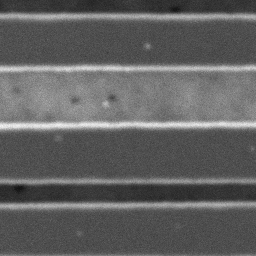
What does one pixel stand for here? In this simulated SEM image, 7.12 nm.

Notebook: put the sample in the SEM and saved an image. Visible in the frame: lines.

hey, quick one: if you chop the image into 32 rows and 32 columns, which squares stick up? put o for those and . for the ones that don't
................................
................................
oooooooooooooooooooooooooooooooo
oooooooooooooooooooooooooooooooo
oooooooooooooooooooooooooooooooo
oooooooooooooooooooooooooooooooo
oooooooooooooooooooooooooooooooo
oooooooooooooooooooooooooooooooo
oooooooooooooooooooooooooooooooo
................................
................................
................................
................................
................................
................................
.......o..ooo..ooo...oo.oooooooo
oooooooooooooooooooooooooooooooo
oooooooooooooooooooooooooooooooo
oooooooooooooooooooooooooooooooo
oooooooooooooooooooooooooooooooo
oooooooooooooooooooooooooooooooo
oooooooooooooooooooooooooooooooo
oooooooooooooooooooooooooooooooo
................................
................................
.....ooooooooooooooooooooooooooo
oooooooooooooooooooooooooooooooo
oooooooooooooooooooooooooooooooo
oooooooooooooooooooooooooooooooo
oooooooooooooooooooooooooooooooo
oooooooooooooooooooooooooooooooo
oooooooooooooooooooooooooooooooo